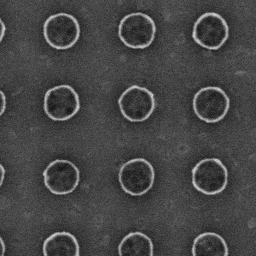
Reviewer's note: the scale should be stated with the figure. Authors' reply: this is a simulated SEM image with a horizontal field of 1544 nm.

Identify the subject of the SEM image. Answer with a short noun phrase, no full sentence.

a regular array of raised bodies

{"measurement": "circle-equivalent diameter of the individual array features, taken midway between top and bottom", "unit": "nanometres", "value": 205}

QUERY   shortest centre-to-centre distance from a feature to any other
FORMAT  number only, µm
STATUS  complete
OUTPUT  0.441